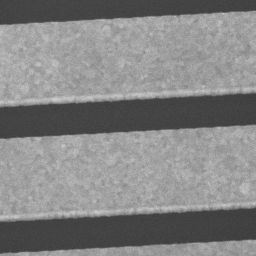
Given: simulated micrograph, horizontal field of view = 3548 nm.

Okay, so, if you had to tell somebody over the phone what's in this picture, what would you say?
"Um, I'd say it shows lines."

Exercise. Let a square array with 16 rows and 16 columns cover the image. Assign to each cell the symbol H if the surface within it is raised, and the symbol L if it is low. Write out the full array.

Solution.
LLLLLLLLLLLLLLLL
LHHHHHHHHHHHHHHH
HHHHHHHHHHHHHHHH
HHHHHHHHHHHHHHHH
HHHHHHHHHHHHHHHH
HHHHHHHHHHHHHHHH
HHLLLLLLLLLLLLLL
LLLLLLLLLLLLLLLL
LLLHHHHHHHHHHHHH
HHHHHHHHHHHHHHHH
HHHHHHHHHHHHHHHH
HHHHHHHHHHHHHHHH
HHHHHHHHHHHHHHHH
HHHHHLLLLLLLLLLL
LLLLLLLLLLLLLLLL
LLLLLLHHHHHHHHHH